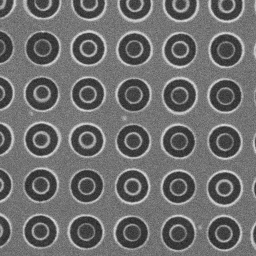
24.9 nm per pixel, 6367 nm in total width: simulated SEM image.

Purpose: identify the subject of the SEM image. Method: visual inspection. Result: an array of small figures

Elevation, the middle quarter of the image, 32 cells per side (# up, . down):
#################.##########...#
################################
################################
#####..##########.##############
###......######.....######......
##........####.......####.......
##..####..###...###...###..###..
##..####..###...###...###..####.
##..####..###...###..####..####.
##........###...##...####...##..
###......#####.......####.......
####...#########...#######.....#
################################
################################
################################
####....#######....########...##
##.......#####......######......
##...##...####..##...####.......
##..####..###..####..###...####.
##..####..###..####...##...####.
##...##...###...###..####..####.
##.......#####.......####.......
####....######......######.....#
#################.##########..##
################################
################################
#####..#########..##########.###
###......#####......######.....#
##.......####........####.......
##..###...###...###..####..###..
#...####..###..####..###...####.
##..###...###...###..###...###..